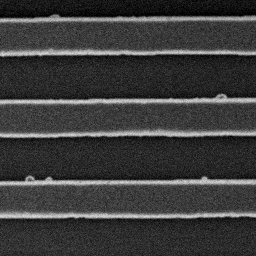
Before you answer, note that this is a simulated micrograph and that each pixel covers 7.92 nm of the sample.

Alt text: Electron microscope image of lines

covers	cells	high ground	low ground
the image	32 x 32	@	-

--------------------------------
--------------------------------
@@@@@@@@@@@@@@@@@@@@@@@@@@@@@@@@
@@@@@@@@@@@@@@@@@@@@@@@@@@@@@@@@
@@@@@@@@@@@@@@@@@@@@@@@@@@@@@@@@
@@@@@@@@@@@@@@@@@@@@@@@@@@@@@@@@
@@@@@@@@@@@@@@@@@@@@@@@@@@@@@@@@
--------------------------------
--------------------------------
--------------------------------
--------------------------------
--------------------------------
-------------------------@--@@@@
@@@@@@@@@@@@@@@@@@@@@@@@@@@@@@@@
@@@@@@@@@@@@@@@@@@@@@@@@@@@@@@@@
@@@@@@@@@@@@@@@@@@@@@@@@@@@@@@@@
@@@@@@@@@@@@@@@@@@@@@@@@@@@@@@@@
--------------------------------
--------------------------------
--------------------------------
--------------------------------
--------------------------------
--------------------------------
@@@@@@@@@@@@@@@@@@@@@@@@@@@@@@@@
@@@@@@@@@@@@@@@@@@@@@@@@@@@@@@@@
@@@@@@@@@@@@@@@@@@@@@@@@@@@@@@@@
@@@@@@@@@@@@@@@@@@@@@@@@@@@@@@@@
--------------------------------
--------------------------------
--------------------------------
--------------------------------
--------------------------------